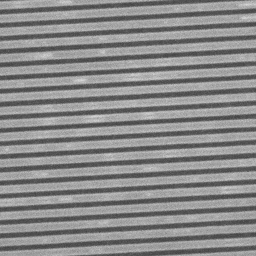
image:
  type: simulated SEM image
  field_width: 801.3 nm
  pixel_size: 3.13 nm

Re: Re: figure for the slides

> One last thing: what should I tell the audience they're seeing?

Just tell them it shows parallel lines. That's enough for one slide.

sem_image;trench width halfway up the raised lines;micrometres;0.016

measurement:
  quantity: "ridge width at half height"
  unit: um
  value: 0.025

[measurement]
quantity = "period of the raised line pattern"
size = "41.2 nm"